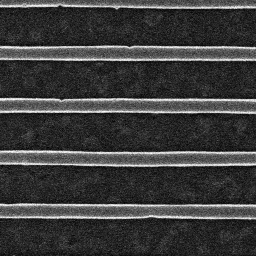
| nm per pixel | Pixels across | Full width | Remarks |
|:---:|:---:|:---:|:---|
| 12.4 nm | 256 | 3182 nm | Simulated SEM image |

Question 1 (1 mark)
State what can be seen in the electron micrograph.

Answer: parallel lines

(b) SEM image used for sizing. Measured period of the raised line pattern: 0.654 um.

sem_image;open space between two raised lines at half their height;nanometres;499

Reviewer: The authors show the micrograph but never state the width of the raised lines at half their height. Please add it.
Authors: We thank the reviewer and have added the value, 0.155 um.